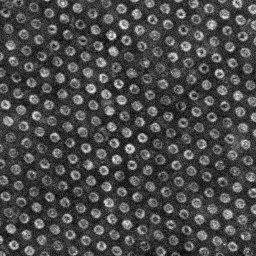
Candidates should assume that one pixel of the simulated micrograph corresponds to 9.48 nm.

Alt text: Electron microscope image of a regular array of raised bodies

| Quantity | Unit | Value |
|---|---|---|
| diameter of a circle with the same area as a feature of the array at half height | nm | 80.7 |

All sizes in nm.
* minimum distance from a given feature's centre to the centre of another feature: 153